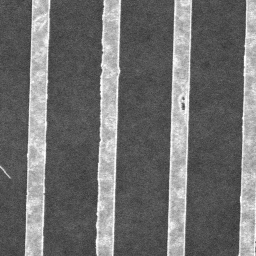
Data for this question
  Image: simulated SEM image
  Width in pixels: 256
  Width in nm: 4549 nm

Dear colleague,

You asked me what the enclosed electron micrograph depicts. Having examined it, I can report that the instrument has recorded one or a few lines or trenches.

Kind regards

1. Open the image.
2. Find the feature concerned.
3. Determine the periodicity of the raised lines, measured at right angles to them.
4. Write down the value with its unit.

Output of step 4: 1260 nanometers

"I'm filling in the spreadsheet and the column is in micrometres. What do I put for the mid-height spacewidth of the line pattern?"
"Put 0.983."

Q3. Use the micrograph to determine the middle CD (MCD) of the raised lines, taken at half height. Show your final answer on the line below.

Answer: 15.7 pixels